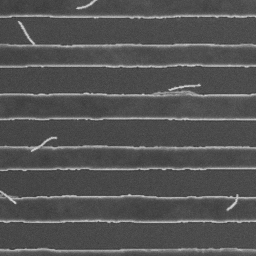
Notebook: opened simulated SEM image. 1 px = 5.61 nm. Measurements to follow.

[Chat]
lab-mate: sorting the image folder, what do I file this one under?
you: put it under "lines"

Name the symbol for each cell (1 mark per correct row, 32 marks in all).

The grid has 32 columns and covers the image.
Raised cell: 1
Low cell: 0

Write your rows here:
11111111111111111111111111111111
11111111111111111111111111111111
00000000000000000000000000000000
00000000000000000000000000000000
00000000000000000000000000000000
00000000000000000000000000000000
11111111111111111111111111111111
11111111111111111111111111111111
00000000000000000000000000000000
00000000000000000000000000000000
00000000000000000000000000000000
00000000000000000000000000000000
11111111111111111111111111111111
11111111111111111111111111111111
11111111111111111111111111111111
00000000000000000000000000000000
00000000000000000000000000000000
00000000000000000000000000000000
11111111111111111111111111111111
11111111111111111111111111111111
11111111111111111111111111111111
00000000000000000000000000000000
00000000000000000000000000000000
00000000000000000000000000000000
10000001110000011100000000000000
11111111111111111111111111111111
11111111111111111111111111111111
11111111111111111111111111111111
00000000000000000000000000000000
00000000000000000000000000000000
00000000000000000000000000000000
11111111111111111111111111111111